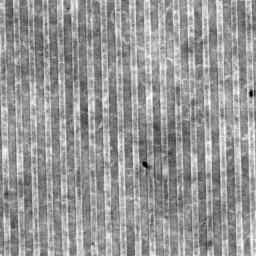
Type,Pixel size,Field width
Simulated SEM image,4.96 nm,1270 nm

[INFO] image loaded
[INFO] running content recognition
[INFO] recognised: parallel lines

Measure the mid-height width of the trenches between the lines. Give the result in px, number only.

8.25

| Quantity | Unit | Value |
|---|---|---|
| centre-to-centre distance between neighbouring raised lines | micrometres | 0.0719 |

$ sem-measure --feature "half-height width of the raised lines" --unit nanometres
28.5